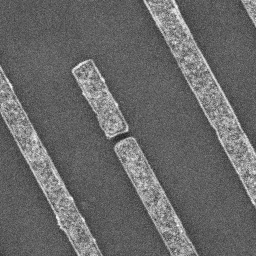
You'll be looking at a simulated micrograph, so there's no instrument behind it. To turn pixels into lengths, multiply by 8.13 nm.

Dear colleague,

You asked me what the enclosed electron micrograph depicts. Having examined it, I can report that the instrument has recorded one or a few lines or trenches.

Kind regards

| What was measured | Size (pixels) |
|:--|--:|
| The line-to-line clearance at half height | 62.6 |